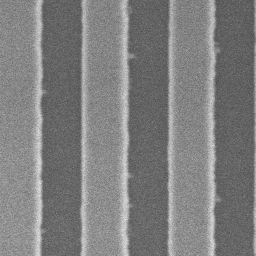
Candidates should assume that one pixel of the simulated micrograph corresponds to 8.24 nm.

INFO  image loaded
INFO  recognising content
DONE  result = lines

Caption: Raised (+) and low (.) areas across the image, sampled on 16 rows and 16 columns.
+++..+++...++...
+++..+++...++...
+++..+++...++...
+++..+++...++...
+++..+++...++...
+++..+++...++...
+++..+++...++...
+++..+++...++...
+++..+++...++...
+++..+++...++...
+++..+++...++...
+++..+++...++...
+++..+++...++...
+++..+++...++...
+++..+++...++...
+++..+++...++...